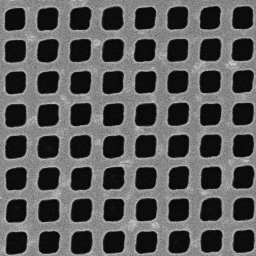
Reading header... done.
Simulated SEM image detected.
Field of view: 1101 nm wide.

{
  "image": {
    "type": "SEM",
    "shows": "a regular array of holes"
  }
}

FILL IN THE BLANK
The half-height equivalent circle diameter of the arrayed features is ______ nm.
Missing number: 99.4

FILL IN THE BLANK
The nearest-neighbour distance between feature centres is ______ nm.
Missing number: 136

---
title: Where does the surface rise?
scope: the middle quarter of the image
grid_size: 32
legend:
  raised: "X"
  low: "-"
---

XXXXXXXXXXXXXXXXXXXXXXXXXXXXXXXX
XXXXXXXXXXXXXXXXXXXXXXXXXXXXXXXX
XX-----XXX-----XXX-----XXX-----X
X------XXX-----XXX-----XXX-----X
X------XXX-----XXX-----XXX-----X
X------XXX-----XXX-----XXX-----X
XX----XXXX----XXXX-----XXX-----X
XXXXXXXXXXXXXXXXXXXXXXXXXXXXXXXX
XXXXXXXXXXXXXXXXXXXXXXXXXXXXXXXX
XXXXXXXXXXXXXXXXXXXXXXXXXXXXXXXX
XX-----XXX-----XXX-----XXXX----X
XX-----XXX-----XXX-----XXX-----X
XX-----XXX-----XXX-----XXX-----X
XX-----XXX-----XXX-----XXX-----X
XX----XXXX-----XXX-----XXX-----X
XXXXXXXXXXX-XXXXXXX-XXXXXXX-XXXX
XXXXXXXXXXXXXXXXXXXXXXXXXXXXXXXX
XXXXXXXXXXXXXXXXXXXXXXXXXXXXXXXX
XX-----XXX-----XXX-----XXX-----X
XX-----XXX-----XXX-----XXX-----X
X------XXX-----XXX-----XXX-----X
XX-----XXX-----XXX-----XXX-----X
XX----XXXX-----XXX-----XXX-----X
XX---XXXXXXXXXXXXXXXXXXXXXXXXXXX
XXXXXXXXXXXXXXXXXXXXXXXXXXXXXXXX
XXXXXXXXXXXXXXXXXXXXXXXXXXXXX-XX
XXX----XXX-----XXX-----XXXX----X
XX-----XXX-----XXX-----XXX-----X
XX-----XXX-----XXX-----XXX-----X
XX-----XXX-----XXX-----XXX-----X
XX-----XXX-----XXX-----XXX-----X
XXX---XXXXXXXXXXXXXXXXXXXXXXXXXX